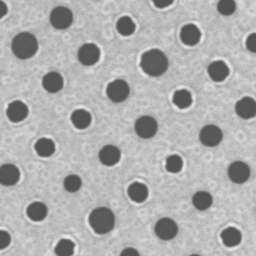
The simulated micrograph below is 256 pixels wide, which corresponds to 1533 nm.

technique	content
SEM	a regular array of holes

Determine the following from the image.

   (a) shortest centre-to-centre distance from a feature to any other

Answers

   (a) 275 nm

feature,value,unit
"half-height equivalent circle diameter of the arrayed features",21.8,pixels